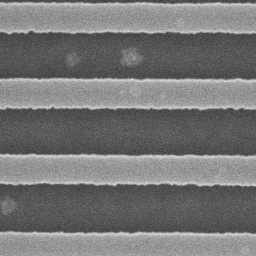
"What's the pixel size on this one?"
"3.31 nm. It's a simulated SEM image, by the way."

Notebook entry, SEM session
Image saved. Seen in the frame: lines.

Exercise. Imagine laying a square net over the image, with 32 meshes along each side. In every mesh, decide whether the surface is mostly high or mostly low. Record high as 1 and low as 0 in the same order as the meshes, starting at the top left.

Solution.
11111111111111111111101111111111
11111111111111111111111111111111
11111111111111111111111111111111
11111111111111111111111111111111
00000000000000000000000000000000
00000000000000000000000000000000
00000000000000000000000000000000
00000000000000000000000000000000
00000000000000000000000000000000
00000000000000000000000000000000
11111111111111111111111111111111
11111111111111111111111111111111
11111111111111111111111111111111
11111111111111111111111111111111
00000000000000000000000000000000
00000000000000000000000000000000
00000000000000000000000000000000
00000000000000000000000000000000
00000000000000000000000000000000
11111111111111110011110110010000
11111111111111111111111111111111
11111111111111111111111111111111
11111111111111111111111111111111
00000000000000000000000000000000
00000000000000000000000000000000
00000000000000000000000000000000
00000000000000000000000000000000
00000000000000000000000000000000
00000000000000000000000000000000
11111111111111111111111111111111
11111111111111111111111111111111
11111111111111111111111111111111